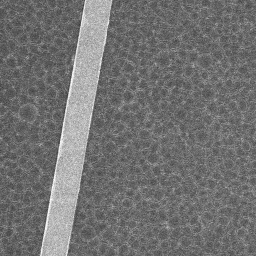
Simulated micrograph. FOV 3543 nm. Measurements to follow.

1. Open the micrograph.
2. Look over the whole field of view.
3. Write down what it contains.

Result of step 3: one or a few lines or trenches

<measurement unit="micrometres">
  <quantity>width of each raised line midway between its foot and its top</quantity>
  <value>0.356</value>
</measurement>